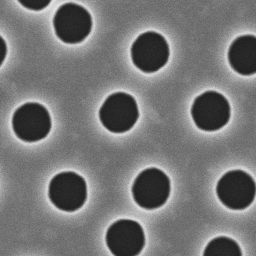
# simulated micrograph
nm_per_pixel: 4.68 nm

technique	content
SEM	holes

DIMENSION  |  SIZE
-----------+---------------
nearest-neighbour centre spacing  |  0.365 micrometres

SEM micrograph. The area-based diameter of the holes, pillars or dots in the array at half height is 185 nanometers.